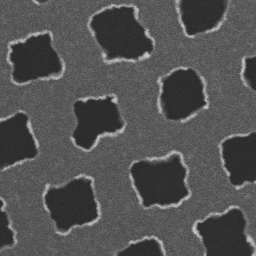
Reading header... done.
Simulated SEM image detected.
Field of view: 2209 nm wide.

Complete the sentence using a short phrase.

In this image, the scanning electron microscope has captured holes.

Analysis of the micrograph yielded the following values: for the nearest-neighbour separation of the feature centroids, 744 nm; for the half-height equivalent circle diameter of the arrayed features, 420 nm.